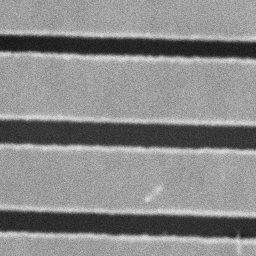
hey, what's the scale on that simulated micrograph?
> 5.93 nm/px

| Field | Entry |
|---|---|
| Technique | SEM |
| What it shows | lines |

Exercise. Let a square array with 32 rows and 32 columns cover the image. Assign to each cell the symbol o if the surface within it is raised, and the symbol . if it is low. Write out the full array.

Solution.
oooooooooooooooooooooooooooooooo
oooooooooooooooooooooooooooooooo
oooooooooooooooooooooooooooooooo
oooooooooooooooooooooooooooooooo
........oooooooooooooooooooooooo
................................
................................
oooooooooooooooooooooooooooooooo
oooooooooooooooooooooooooooooooo
oooooooooooooooooooooooooooooooo
oooooooooooooooooooooooooooooooo
oooooooooooooooooooooooooooooooo
oooooooooooooooooooooooooooooooo
oooooooooooooooooooooooooooooooo
oooooooooooooooooooooooooooooooo
......................oooooooooo
................................
................................
ooooooooooooooooooooo....o......
oooooooooooooooooooooooooooooooo
oooooooooooooooooooooooooooooooo
oooooooooooooooooooooooooooooooo
oooooooooooooooooooooooooooooooo
oooooooooooooooooooooooooooooooo
oooooooooooooooooooooooooooooooo
oooooooooooooooooooooooooooooooo
.......ooooooooooooooooooooooooo
................................
................................
ooooooooooooooooooo.oo..........
oooooooooooooooooooooooooooooooo
oooooooooooooooooooooooooooooooo